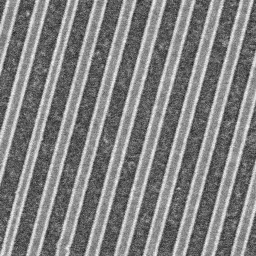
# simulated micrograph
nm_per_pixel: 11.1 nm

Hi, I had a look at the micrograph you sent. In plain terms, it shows parallel lines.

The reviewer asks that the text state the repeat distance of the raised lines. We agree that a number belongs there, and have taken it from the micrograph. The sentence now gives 313 nm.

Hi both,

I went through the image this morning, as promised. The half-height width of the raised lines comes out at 107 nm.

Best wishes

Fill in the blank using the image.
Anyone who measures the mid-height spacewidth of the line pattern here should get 18.5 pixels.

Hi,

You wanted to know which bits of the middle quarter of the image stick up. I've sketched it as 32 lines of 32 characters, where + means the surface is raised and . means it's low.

....++.....++.....+++....+++....
...+++.....++.....+++....+++....
...+++....+++.....+++....+++....
...++.....++.....+++.....++.....
..+++.....++.....+++....+++.....
..+++....+++.....++.....+++....+
..+++....+++.....++.....+++....+
..++.....++.....+++.....++.....+
.+++.....++.....+++....+++.....+
.+++....+++.....++.....+++....++
.+++....+++....+++.....++.....++
.++.....+++....+++.....++.....++
+++.....++.....+++....+++.....++
+++....+++.....++.....+++....+++
++.....+++....+++.....++.....++.
++.....++.....+++....+++.....++.
++.....++.....+++....+++....+++.
++....+++.....++.....+++....+++.
+.....++.....+++.....++.....++..
+.....++.....+++....+++.....++..
+.....++.....+++....+++....+++..
+....+++.....++.....+++....+++..
.....++.....+++.....++.....+++..
.....++.....+++....+++.....++...
....+++.....++.....+++....+++...
....+++....+++.....++.....+++...
....+++....+++.....++.....+++...
....++.....+++....+++.....++....
...+++.....++.....+++....+++....
...+++....+++.....++.....+++....
...++.....+++....+++.....++.....
...++.....+++....+++....+++.....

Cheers